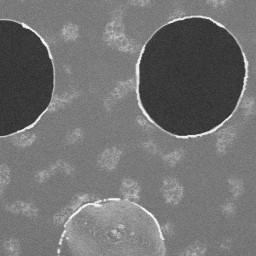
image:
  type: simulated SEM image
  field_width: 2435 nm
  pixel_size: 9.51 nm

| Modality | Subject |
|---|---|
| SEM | holes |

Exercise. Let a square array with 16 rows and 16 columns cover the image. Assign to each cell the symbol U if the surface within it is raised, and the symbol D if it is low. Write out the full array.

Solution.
UUUUUUUUUUUUUUUU
DUUUUUUUUUUDDDUU
DDDUUUUUUDDDDDDU
DDDUUUUUUDDDDDDU
DDDUUUUUUDDDDDDU
DDDUUUUUUDDDDDDU
DDDUUUUUUDDDDDDU
DDUUUUUUUUDDDDUU
UUUUUUUUUUUUUUUU
UUUUUUUUUUUUUUUU
UUUUUUUUUUUUUUUU
UUUUUUUUUUUUUUUU
UUUUUUUUUUUUUUUU
UUUUUUUUUUUUUUUU
UUUUUUUUUUUUUUUU
UUUUUUUUUUUUUUUU